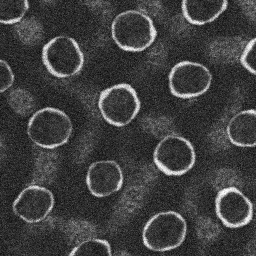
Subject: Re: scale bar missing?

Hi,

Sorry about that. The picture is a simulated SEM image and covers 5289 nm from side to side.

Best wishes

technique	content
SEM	a regular array of raised bodies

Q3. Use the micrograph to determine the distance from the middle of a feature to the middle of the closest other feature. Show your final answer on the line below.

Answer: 73.5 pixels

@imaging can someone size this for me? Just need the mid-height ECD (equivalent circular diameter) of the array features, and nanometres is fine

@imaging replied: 785